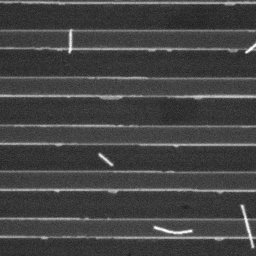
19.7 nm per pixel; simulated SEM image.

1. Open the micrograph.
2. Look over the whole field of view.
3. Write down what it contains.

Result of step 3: lines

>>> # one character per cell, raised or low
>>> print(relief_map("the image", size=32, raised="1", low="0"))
00000000000000000000000000000000
00000000000000000000000000000000
00000000000000000000000000000000
00000000000000000000000000000000
11111111111111111111111111111111
11111111111111111111111111111111
00000000000000000000000000000000
00000000000000000000000000000000
00000000000000000000000000000000
00000000000000000000000000000000
11111111111111111111111111111111
11111111111111111111111111111111
00000000000000000000000000000000
00000000000000000000000000000000
00000000000000000000000000000000
00000000000000000000000000000000
11111111111111111111111111111111
11111111111111111111111111111111
00000000000000000000000000000000
00000000000000000000000000000000
00000000000000000000000000000000
11111111111111111111110000000000
11111111111111111111111111111111
11111111111111111111111111111111
00000000000000000000000000000000
00000000000000000000000000000000
00000000000000000000000000000000
11111111111111111111111111111111
11111111111111111111111111111111
11111111111111111111111111111111
00000000000000000000000000000000
00000000000000000000000000000000